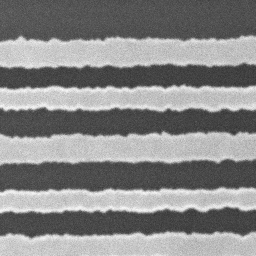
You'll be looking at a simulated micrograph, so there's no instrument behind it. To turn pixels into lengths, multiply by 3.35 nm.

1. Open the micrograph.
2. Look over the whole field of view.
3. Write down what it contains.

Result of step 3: lines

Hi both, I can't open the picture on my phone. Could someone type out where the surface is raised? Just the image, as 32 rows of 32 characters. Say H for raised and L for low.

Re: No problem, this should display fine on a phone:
LLLLLLLLLLLLLLLLLLLLLLLLLLLLLLLL
LLLLLLLLLLLLLLLLLLLLLLLLLLLLLLLL
LLLLLLLLLLLLLLLLLLLLLLLLLLLLLLLL
LLLLLLLLLLLLLLLLLLLLLLLLLLLLLLLL
LLLLLLLLLLLLLLLLLLLLLLLLLLLLLLLL
HHHHHHHHHHHHHHHHHHHHHHHHHHHHHHHH
HHHHHHHHHHHHHHHHHHHHHHHHHHHHHHHH
HHHHHHHHHHHHHHHHHHHHHHHHHHHHHHHH
LLLLLLLLLLLLLLLLLLLLLLLLLLLLLLLL
LLLLLLLLLLLLLLLLLLLLLLLLLLLLLLLL
LLLLLLLLLLLLLLLLLLLLLLLLLLLLLLLL
HHHHHHHHHHHHHHHHHHHHHHHHHHHHHHHH
HHHHHHHHHHHHHHHHHHHHHHHHHHHHHHHH
HHHHHLHHHHHHHHLHHHHHHHHHHHHHHHHH
LLLLLLLLLLLLLLLLLLLLLLLLLLLLLLLL
LLLLLLLLLLLLLLLLLLLLLLLLLLLLLLLL
LLLLLLLLLLLLLLLLLLLLLLLLLLLLLLLL
HHHHHHHHHHHHHHHHHHHHHHHHHHHHHHHH
HHHHHHHHHHHHHHHHHHHHHHHHHHHHHHHH
HHHHHHHHHHHHHHHHHHHHHHHHHHHHHHHH
LLLLLLLLLLLLLLLLLLLLLLLLLLLLLLLL
LLLLLLLLLLLLLLLLLLLLLLLLLLLLLLLL
LLLLLLLLLLLLLLLLLLLLLLLLLLLLLLLL
LLLLLLLLLLLLLLLLLLLLLLLLLLLLLLLL
HHHHHHHHHHHHHHHHHHHHHHHHHHHHHHHH
HHHHHHHHHHHHHHHHHHHHHHHHHHHHHHHH
LLHLLHHHLLLLLLLLLHHLLLLLLLLLLLLL
LLLLLLLLLLLLLLLLLLLLLLLLLLLLLLLL
LLLLLLLLLLLLLLLLLLLLLLLLLLLLLLLL
LHHLLLHHHLLLLLHHHHLHHHHHHHHHHHLH
HHHHHHHHHHHHHHHHHHHHHHHHHHHHHHHH
HHHHHHHHHHHHHHHHHHHHHHHHHHHHHHHH